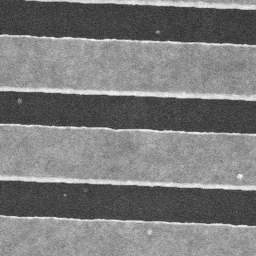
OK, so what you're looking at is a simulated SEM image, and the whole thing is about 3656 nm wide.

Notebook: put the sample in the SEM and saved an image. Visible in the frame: lines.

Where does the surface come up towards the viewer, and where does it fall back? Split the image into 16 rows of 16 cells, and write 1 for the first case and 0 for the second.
0000000000000011
0000000000000000
1111111100000000
1111111111111111
1111111111111111
1111111111111111
0000000000000000
0000000000000000
1111111111111111
1111111111111111
1111111111111111
0000000111111111
0000000000000000
1000000000000000
1111111111111111
1111111111111111